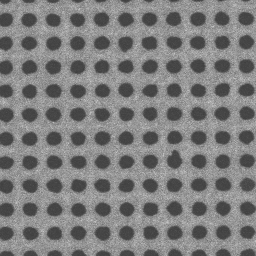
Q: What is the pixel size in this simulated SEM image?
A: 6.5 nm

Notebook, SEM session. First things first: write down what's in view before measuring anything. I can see a regular array of holes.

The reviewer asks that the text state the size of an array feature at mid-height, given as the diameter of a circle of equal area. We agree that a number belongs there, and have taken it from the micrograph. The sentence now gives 93.6 nanometers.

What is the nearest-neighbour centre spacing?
153 nm